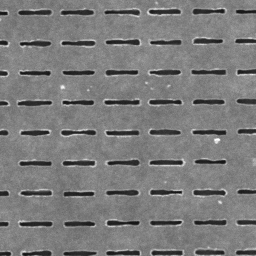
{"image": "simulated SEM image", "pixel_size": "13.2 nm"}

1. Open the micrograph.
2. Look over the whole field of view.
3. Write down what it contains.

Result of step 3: a regular array of holes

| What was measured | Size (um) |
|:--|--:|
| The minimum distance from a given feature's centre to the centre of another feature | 0.393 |